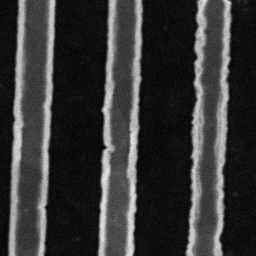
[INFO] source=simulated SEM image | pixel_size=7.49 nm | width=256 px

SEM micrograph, one or a few lines or trenches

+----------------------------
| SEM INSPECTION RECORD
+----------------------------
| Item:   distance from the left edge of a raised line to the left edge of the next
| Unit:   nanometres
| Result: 666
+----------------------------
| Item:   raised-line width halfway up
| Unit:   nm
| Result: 221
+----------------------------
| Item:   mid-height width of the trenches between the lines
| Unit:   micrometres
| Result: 0.449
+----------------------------